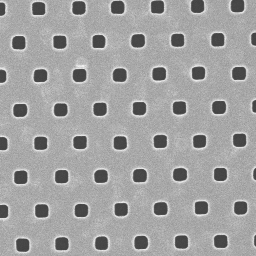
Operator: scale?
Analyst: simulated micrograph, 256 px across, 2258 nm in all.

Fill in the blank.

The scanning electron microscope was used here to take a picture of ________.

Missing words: a regular array of holes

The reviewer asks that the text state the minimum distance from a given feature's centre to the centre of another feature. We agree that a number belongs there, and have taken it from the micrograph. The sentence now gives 341 nanometers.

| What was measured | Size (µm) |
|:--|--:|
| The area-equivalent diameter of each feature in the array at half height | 0.127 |